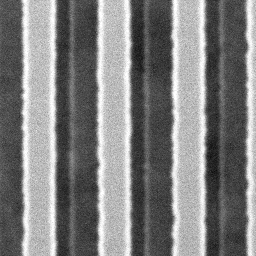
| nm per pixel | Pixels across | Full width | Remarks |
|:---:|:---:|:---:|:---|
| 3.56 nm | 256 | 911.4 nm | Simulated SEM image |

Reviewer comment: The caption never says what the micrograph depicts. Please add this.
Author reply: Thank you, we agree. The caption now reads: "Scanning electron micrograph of lines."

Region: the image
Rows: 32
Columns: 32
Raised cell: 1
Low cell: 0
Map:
00011110000011110000001110000001
00011110000011110000001110000001
00011110000011110000001110000001
00011110000011110000001110000001
00011110000011110000001110000001
00011110000011110000001111000001
00011110000011110000001110000001
00011110000011110000001111000001
00011110000011110000001110000001
00011110000011110000001110000001
00011110000011110000001110000001
00011110000011110000001111000001
00011110000011110000001110000001
00011110000011110000001110000001
00011110000011110000001110000001
00011110000011110000001111000001
00011110000011110000001111000001
00011110000011110000001110000001
00011110000011110000001111000001
00011110000011110000001110000001
00011110000001110000001111000001
00011110000011110000001110000001
00011110000011110000001110000001
00011110000001110000001111000001
00011110000001110000001111000001
00011110000011110000001111000001
00011110000001110000001111000001
00011110000001110000001110000001
00011110000011110000001111000001
00011110000001110000001111000001
00011110000011110000001111000001
00011110000001110000001111000001